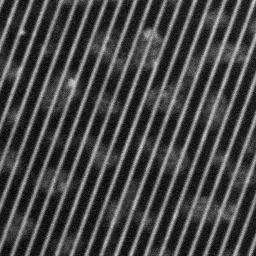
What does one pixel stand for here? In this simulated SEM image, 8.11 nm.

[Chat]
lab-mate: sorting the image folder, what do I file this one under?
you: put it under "parallel lines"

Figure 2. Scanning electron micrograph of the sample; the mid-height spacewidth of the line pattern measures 97.9 nm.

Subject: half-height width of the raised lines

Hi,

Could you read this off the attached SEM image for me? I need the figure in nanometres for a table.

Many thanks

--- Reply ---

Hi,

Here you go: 15.2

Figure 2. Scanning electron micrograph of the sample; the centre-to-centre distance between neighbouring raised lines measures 113 nm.